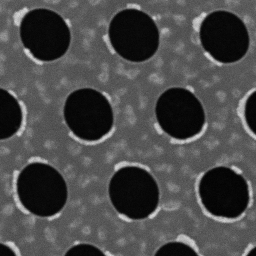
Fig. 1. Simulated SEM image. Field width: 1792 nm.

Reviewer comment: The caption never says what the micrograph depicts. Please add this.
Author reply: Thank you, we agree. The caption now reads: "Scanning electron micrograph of a regular array of holes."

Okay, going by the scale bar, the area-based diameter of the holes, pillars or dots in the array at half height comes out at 361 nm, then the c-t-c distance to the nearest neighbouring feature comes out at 622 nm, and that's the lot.